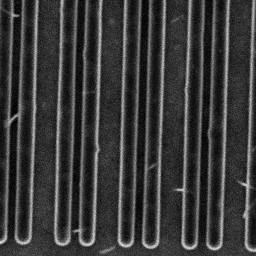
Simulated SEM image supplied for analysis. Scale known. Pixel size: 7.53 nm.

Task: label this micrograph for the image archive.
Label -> parallel lines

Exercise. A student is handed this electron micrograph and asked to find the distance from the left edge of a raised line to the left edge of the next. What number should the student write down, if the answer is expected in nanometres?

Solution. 239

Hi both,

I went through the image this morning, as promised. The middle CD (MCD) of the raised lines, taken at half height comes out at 117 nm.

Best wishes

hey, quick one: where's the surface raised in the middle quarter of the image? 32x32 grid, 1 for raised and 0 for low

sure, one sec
11100111100000011110011110000001
11000111100000011110011110000001
11000111100000011110011110000001
11000111100000011100011110000001
11000111100000011100011110000001
11100111100000011100011110000001
11100111100000011100011100000001
11100111100000011100011100000001
11100111100000011100011100000001
11000111100000011100011100000001
11000111100000011100011100000001
11000111100000011100011100000011
11000111000000011100011100000011
11000111000000011100011100000011
11000111000000011100011100000011
11000111000000111100011100000011
11000111000000111100011100000001
11000111000000111100011100000011
11000111000000111100011100000011
11000111000000111100011100000011
11000111000000111100011100000011
11000111100000111100011100000011
11000111000000011100011100000011
11000111000000111100011100000011
11001111000000111100011100000011
11001111000000111100011100000011
11001111000000111100111100000011
11001111000000111100111100000011
11001111000000111100111100000011
11001111000000111100111100000011
11001111000000111100111100000011
11001111000000111100111100000011